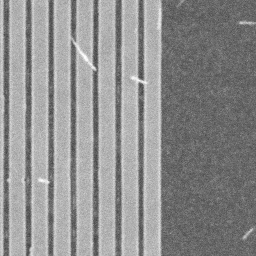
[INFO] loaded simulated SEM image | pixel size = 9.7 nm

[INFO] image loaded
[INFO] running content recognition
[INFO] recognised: parallel lines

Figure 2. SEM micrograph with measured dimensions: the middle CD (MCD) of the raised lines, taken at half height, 16.1 pixels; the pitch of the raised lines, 22.4 px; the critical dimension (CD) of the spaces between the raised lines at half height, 0.0642 micrometres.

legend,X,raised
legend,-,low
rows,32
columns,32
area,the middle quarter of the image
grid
X--XXXX--XXXX--XXX--XXXX--------
X--XXXX--XXXX--XXX--XXXX--------
X--XXXX--XXXX--XXX--XXXX--------
X--XXXX--XXXX--XXXX-XXXX--------
X--XXXX--XXXX--XXXX-XXXX--------
X--XXXX--XXXX--XXX--XXXX--------
X--XXXX--XXXX--XXX--XXXX--------
X--XXXX--XXXX--XXX--XXXX--------
X--XXXX--XXXX--XXX--XXXX--------
X--XXXX--XXXX--XXX--XXXX--------
X--XXXX--XXXX--XXX--XXXX--------
X--XXXX--XXXX--XXX--XXXX--------
X--XXXX--XXXX--XXX--XXXX--------
X--XXXX--XXXX--XXX--XXXX--------
X--XXXX--XXXX--XXX--XXXX--------
X--XXXX--XXXX--XXX--XXXX--------
X--XXXX--XXXX--XXX--XXXX--------
X--XXXX--XXXX--XXX--XXXX--------
X--XXXX--XXXX--XXX--XXXX--------
X--XXXX--XXXX--XXX--XXXX--------
X--XXXX--XXXX--XXX--XXXX--------
X--XXXX--XXXX--XXX--XXXX--------
X--XXXX--XXXX--XXX--XXXX--------
X--XXXX--XXXX--XXX--XXXX--------
X--XXXX--XXXX--XXX--XXXX--------
X--XXXX--XXXX--XXX--XXXX--------
X--XXXX--XXXX--XXX--XXXX--------
X--XXXX--XXXX--XXX--XXXX--------
X--XXXX--XXXX--XXX--XXXX--------
X--XXXX--XXXX--XXX--XXXX--------
X--XXXX--XXXX--XXX--XXXX--------
X--XXXX--XXXX--XXXX-XXXX--------